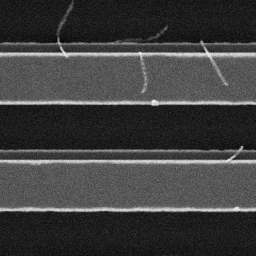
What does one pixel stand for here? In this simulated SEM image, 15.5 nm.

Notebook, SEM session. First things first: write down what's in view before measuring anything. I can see lines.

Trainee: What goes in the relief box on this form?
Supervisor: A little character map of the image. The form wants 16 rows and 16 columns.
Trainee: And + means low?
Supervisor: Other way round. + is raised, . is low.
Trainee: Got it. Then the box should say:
................
................
................
++++++++++++++++
++++++++++++++++
++++++++++++++++
++++++++++++++++
................
................
++++++++++++++++
++++++++++++++++
++++++++++++++++
++++++++++++++++
................
................
................